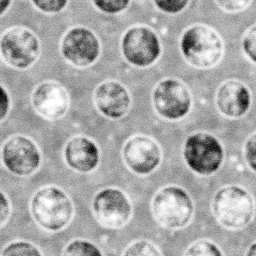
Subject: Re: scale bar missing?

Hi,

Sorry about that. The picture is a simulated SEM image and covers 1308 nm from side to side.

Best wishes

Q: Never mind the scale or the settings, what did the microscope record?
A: a regular array of holes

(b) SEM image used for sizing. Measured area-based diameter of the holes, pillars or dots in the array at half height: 204 nm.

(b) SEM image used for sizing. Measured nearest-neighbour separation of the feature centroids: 308 nanometres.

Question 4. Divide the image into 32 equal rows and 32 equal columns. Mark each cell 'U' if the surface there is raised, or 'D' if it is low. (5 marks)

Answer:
DUUUDDDDUUUUDDDDUUUDDDDUUUUDDDDU
DUUUUDDUUUUUUDDUUUUUDDUUUUUUUUUU
UUUUUUUUUUUUUUUUUUUUUUUUUUUUUUUU
UUUUUUUUUDDUUUUUDDDUUUUUDDUUUUUD
DDDDUUUUDDDDUUUDDDDDUUUDDDDUUUDD
DDDDDUUUDDDDUUUDDDDDUUDDDDDDUUDD
DDDDDUUUDDDDUUUDDDDDUUUDDDDDUUUD
UDDDUUUUDDDDUUUUDDDDUUUDDDDUUUUD
UUDUUUUUUUUUUUUUUUUUUUUUUUUUUUUU
UUUUUUUUUUUUUUUUUUUUUUUUUUUUUUUU
UUUUUDDUUUUUUDDUUUUUDDDUUUUUDDUU
DUUUDDDDUUUUDDDDUUUDDDDDUUUDDDDU
DUUUDDDDUUUUDDDDUUUDDDDDUUUDDDDU
DUUUDDDDUUUUDDDDUUUDDDDDUUUDDDDU
DUUUUDDDUUUUUDDUUUUUDDDUUUUUDDUU
UUUUUUUUUUUUUUUUUUUUUUUUUUUUUUUU
UUUUUUUUUUUUUUUUUUUUUUUUUUUUUUUU
UDDDUUUUUDDUUUUUDDDUUUUDDDDUUUUD
DDDDDUUUDDDDUUUDDDDDUUUDDDDDUUDD
DDDDDUUUDDDDUUUDDDDDUUUDDDDDUUDD
DDDDDUUUDDDDUUUUDDDDUUUDDDDDUUUD
UDDDUUUUUUDUUUUUUDDUUUUUDDDUUUUU
UUUUUUUUUUUUUUUUUUUUUUUUUUUUUUUU
UUUUUDDUUUUUUDUUUUUUUDDUUUUUDDUU
DUUUDDDDUUUUDDDDUUUDDDDDUUUDDDDU
DUUUDDDDDUUUDDDDUUUDDDDDUUDDDDDD
DUUUDDDDDUUUDDDDUUUDDDDDUUUDDDDD
DUUUDDDDDUUUDDDDUUUUDDDDUUUDDDDU
UUUUUDDDUUUUUUUUUUUUUUUUUUUUDDUU
UUUUUUUUUUUUUUUUUUUUUUUUUUUUUUUU
UDDDUUUUUDDDUUUUDDDUUUUUDDDUUUUU
DDDDDUUUDDDDDUUUDDDDUUUDDDDDUUUD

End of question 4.